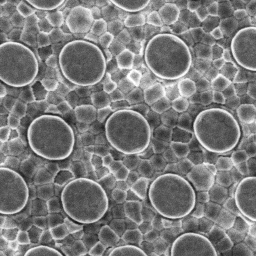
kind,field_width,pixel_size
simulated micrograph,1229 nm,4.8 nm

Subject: raised bodies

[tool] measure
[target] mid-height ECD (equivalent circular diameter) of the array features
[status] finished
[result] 215 nanometres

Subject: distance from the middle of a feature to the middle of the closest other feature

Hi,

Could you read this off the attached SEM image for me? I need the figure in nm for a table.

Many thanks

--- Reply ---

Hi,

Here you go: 374